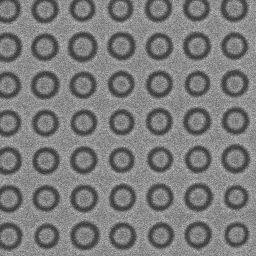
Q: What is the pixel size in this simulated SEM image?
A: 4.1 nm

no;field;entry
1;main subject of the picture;a regular array of ring-shaped grooves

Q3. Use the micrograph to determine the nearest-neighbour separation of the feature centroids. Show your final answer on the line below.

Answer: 153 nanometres